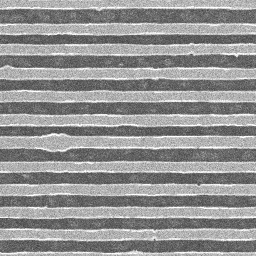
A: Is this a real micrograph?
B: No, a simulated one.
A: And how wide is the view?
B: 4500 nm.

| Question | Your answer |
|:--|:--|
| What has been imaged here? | parallel lines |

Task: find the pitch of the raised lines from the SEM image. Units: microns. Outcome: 0.401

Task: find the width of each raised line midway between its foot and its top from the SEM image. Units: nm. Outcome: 191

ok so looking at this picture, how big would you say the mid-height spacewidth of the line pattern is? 0.209 microns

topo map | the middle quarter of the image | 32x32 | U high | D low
DDDDDDDDDDDDDDDDDDDDDDDDDDDDDDDD
UUUUUUUUUUUUUUUUUUUUUUUUUUUUUUUU
UUUUUUUUUUUUUUUUUUUUUUUUUUUUUUUU
UUUUUUUUUUUUUUUUUUUUUDUUUUUUUUUU
DDDDDDDDDDDDDDDDDDDDDDDDDDDDDDDD
DDDDDDDDDDDDDDDDDDDDDDDDDDDDDDDD
DDDDDDDDDDDDDDDDDDDDDDDDDDDDDDDD
UUUUUUUUUUUUUUUUUUUUUUUUUUUUUUUU
UUUUUUUUUUUUUUUUUUUUUUUUUUUUUUUU
UUUUUUUUUUUUUDUUUDDUUUUDUDDDDDDD
DDDDDDDDDDDDDDDDDDDDDDDDDDDDDDDD
DDDDDDDDDDDDDDDDDDDDDDDDDDDDDDDD
DDDDDDDDDDDDDDDDDDDDDDDDDDDDDDDD
UUUUUUUUUUUUUUUUUUUUUUUUUUUUUUUU
UUUUUUUUUUUUUUUUUUUUUUUUUUUUUUUU
DDDDDDDDDDDUDDDDDDDDUDDDDDDDDDDD
DDDDDDDDDDDDDDDDDDDDDDDDDDDDDDDD
DDDDDDDDDDDDDDDDDDDDDDDDDDDDDDDD
UUUUUUUUUUUUUUUUUUUUUUUUUUUUUUUU
UUUUUUUUUUUUUUUUUUUUUUUUUUUUUUUU
UUUUUUUUUUUUUUUUUUUUUUUUUUUUUUUU
UDDDDDDDDDDDDDDDDDDDDDDDDDDDDDDD
DDDDDDDDDDDDDDDDDDDDDDDDDDDDDDDD
DDDDDDDDDDDDDDDDDDDDDDDDDDDDDDDD
DDDDDDDDDDDDDDDDDDDDDDDDDDDDDDDD
UUUUUUUUUUUUUUUUUUUUUUUUUUUUUUUU
UUUUUUUUUUUUUUUUUUUUUUUUUUUUUUUU
DDDDDDDDDDDDDDDDDDDDDDDDDDDDDDDD
DDDDDDDDDDDDDDDDDDDDDDDDDDDDDDDD
DDDDDDDDDDDDDDDDDDDDDDDDDDDDDDDD
UUUUUUUUUUUUUUUUUUUUUUUUUUUUUUUU
UUUUUUUUUUUUUUUUUUUUUUUUUUUUUUUU